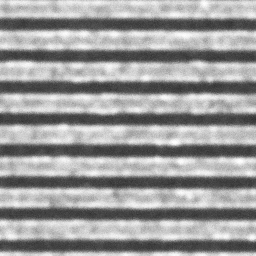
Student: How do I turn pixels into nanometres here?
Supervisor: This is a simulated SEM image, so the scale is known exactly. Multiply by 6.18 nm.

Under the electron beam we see parallel lines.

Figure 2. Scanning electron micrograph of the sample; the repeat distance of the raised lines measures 0.195 µm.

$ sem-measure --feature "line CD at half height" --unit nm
104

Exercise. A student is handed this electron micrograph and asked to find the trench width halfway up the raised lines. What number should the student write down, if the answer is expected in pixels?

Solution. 14.2